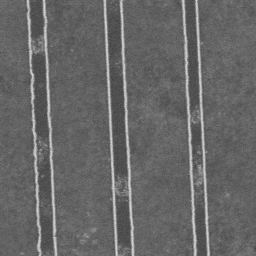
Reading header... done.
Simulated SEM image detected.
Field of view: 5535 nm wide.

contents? one or a few lines or trenches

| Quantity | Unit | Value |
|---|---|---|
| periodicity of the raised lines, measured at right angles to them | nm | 1660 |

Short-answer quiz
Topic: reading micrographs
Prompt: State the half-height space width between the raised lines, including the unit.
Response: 1320 nm